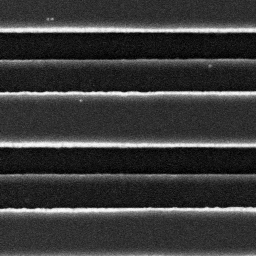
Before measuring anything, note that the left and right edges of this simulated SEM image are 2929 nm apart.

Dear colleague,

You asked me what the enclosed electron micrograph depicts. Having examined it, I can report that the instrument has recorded lines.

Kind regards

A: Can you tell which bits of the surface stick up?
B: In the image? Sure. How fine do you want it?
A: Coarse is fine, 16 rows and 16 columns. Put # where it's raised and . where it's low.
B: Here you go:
################
################
................
................
................
................
################
################
################
................
................
................
................
################
################
################